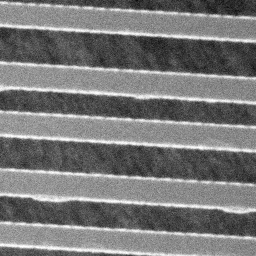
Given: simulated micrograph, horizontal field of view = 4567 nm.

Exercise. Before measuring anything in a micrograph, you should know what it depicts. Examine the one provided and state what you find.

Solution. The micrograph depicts lines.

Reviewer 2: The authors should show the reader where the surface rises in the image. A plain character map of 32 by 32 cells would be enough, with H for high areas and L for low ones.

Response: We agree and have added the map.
HHHLLLLLLLLLLLLLLLLLLLLLLLLLLLLL
HHHHHHHHHHHHHHHHHHHLLLLLLLLLLLLL
HHHHHHHHHHHHHHHHHHHHHHHHHHHHHHHH
LLLLHHHHHHHHHHHHHHHHHHHHHHHHHHHH
LLLLLLLLLLLLLLLLLLLLHHHHHHHHHHHH
LLLLLLLLLLLLLLLLLLLLLLLLLLLLLLLL
LLLLLLLLLLLLLLLLLLLLLLLLLLLLLLLL
LLLLLLLLLLLLLLLLLLLLLLLLLLLLLLLL
HHHHHHHHHHHHLLLLLLLLLLLLLLLLLLLL
HHHHHHHHHHHHHHHHHHHHHHHHHHHLLLLL
HHHHHHHHHHHHHHHHHHHHHHHHHHHHHHHH
LLLLLLLLLHHHHHHHHHHHHHHHHHHHHHHH
LLLLLLLLLLLLLLLLLLLLLLLLLLHHHHHH
LLLLLLLLLLLLLLLLLLLLLLLLLLLLLLLL
HHHHHHHHHHLLLLLLLLLLLLLLLLLLLLLL
HHHHHHHHHHHHHHHHHHHHHHHHHHLLLLLL
HHHHHHHHHHHHHHHHHHHHHHHHHHHHHHHH
LLLLLLLLLHHHHHHHHHHHHHHHHHHHHHHH
LLLLLLLLLLLLLLLLLLLLLLLLLLHHHHHH
LLLLLLLLLLLLLLLLLLLLLLLLLLLLLLLL
LLLLLLLLLLLLLLLLLLLLLLLLLLLLLLLL
HHHHHHLLLLLLLLLLLLLLLLLLLLLLLLLL
HHHHHHHHHHHHHHHHHHHHHHLLLLLLLLLL
HHHHHHHHHHHHHHHHHHHHHHHHHHHHHHHH
LLLHHHHHHHHHHHHHHHHHHHHHHHHHHHHH
LLLLLLLLLLLLLLLLLLHHHHHHHHHHHHHH
LLLLLLLLLLLLLLLLLLLLLLLLLLLLLHHL
LLLLLLLLLLLLLLLLLLLLLLLLLLLLLLLL
HHHHHHHHHHHLLLLLLLLLLLLLLLLLLLLL
HHHHHHHHHHHHHHHHHHHHHHHHHHHHLLLL
HHHHHHHHHHHHHHHHHHHHHHHHHHHHHHHH
LLLLLLLLLLLLLHHHHHHHHHHHHHHHHHHH